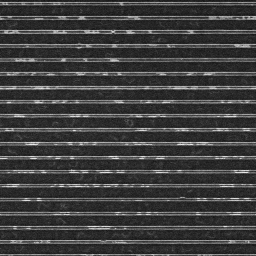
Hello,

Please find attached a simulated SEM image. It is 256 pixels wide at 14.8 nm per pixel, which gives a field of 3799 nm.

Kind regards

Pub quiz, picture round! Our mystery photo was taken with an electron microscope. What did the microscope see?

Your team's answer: parallel lines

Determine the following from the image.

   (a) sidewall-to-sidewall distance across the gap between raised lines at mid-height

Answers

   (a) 165 nanometers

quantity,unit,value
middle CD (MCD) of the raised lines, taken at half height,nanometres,40.8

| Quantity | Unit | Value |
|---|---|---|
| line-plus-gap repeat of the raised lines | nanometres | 208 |